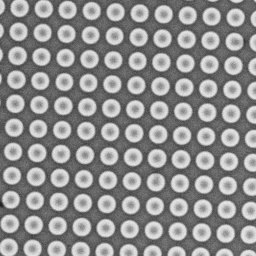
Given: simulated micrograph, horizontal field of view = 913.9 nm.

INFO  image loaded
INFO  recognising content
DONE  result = an array of small figures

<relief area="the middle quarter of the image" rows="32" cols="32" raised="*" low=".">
*....***...***...***..****..****
.......................**....***
................................
**..****...***...**....**.......
**..****..****..****..****..****
**..****..****..****..****..****
*....**...****..****..****..****
.......................**....***
*...............................
**..****..***....**....*........
**..****..****..****..****..***.
**..****..****..****..****..****
*...***...***...****..****..****
.......................**...***.
................................
*...***...***...***....*........
**.*****.*****..****..****..***.
*...****.*****.*****.*****.*****
....***...***...***...****.*****
.......................**...***.
................................
*..****...***...**.....*........
*..****..****..****..****..****.
*..****..****..****..****..****.
....***...***..****..****..****.
......................**....***.
................................
*..****...***...**....*.........
*..****..****..****..****..****.
*..****..****..****..****..****.
....**...****..****..****..****.
......................**....**..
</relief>